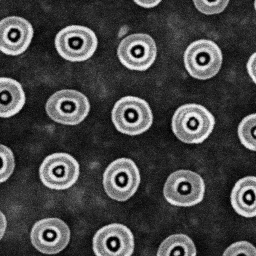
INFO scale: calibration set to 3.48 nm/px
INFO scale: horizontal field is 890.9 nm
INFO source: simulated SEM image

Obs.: a regular array of ring-shaped raised bodies with a dot in the middle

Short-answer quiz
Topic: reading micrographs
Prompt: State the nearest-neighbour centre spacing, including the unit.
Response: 0.218 microns